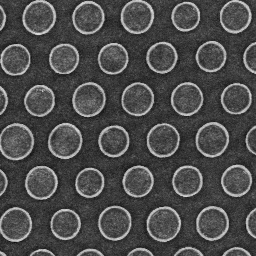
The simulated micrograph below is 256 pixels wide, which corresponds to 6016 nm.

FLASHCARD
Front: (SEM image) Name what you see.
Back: a regular array of raised bodies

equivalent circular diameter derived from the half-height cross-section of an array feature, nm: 707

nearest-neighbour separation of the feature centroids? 1120 nm